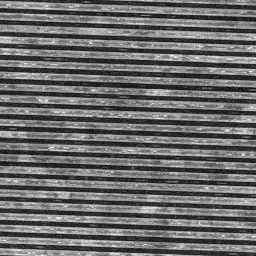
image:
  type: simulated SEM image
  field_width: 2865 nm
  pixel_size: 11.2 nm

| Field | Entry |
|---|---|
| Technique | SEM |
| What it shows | parallel lines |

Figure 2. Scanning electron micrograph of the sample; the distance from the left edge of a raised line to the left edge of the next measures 0.132 microns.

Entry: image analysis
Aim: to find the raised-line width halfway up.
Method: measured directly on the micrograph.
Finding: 65.7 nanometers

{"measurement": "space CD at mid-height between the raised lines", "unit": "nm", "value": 65.7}